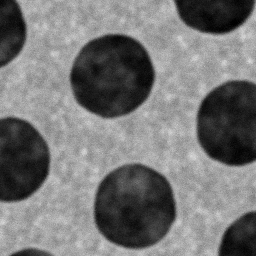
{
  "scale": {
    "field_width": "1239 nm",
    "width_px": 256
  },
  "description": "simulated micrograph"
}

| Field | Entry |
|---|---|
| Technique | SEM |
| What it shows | holes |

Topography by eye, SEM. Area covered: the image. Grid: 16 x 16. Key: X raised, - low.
-XXXXXXXXXX-----
--XXXXXXXXXX---X
--XXXX---XXXXXXX
-XXXX----XXXXXXX
XXXX------XXXXXX
XXXX------XXX---
XXXXX----XXXX---
-XXXXXXXXXXX----
---XXXXXXXXX----
---XXXXXXXXXX---
---XXXX--XXXXXXX
---XXX-----XXXXX
-XXXXX-----XXXXX
XXXXXX-----XXXX-
XXXXXX----XXXX--
XXXXXXXX-XXXXX--